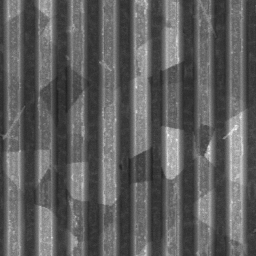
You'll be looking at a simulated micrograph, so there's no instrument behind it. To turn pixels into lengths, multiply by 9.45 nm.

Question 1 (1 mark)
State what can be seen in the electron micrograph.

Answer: parallel lines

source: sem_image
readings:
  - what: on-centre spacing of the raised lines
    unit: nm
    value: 300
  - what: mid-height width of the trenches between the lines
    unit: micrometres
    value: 0.151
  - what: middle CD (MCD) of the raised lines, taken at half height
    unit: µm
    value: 0.15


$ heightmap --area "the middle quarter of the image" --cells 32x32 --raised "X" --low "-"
-XXXX----XXXX----XXXX----XXXX---
-XXXX----XXXX----XXXX----XXXX---
-XXXX----XXXX----XXXX----XXXX---
-XXXX----XXXX----XXXX----XXXX---
-XXXX----XXXX----XXXX----XXXX---
-XXXX----XXXX----XXXX----XXXX---
-XXXX----XXXX----XXXX----XXXX---
-XXXX----XXXX----XXXX----XXXX---
-XXXX----XXXX----XXXX----XXXX---
-XXXX----XXXX----XXXX----XXXX---
-XXXX----XXXX----XXXX----XXXX---
-XXXX----XXXX----XXXX----XXXX---
-XXXX----XXXX----XXXX----XXXX---
-XXXX----XXXX----XXXX----XXXX---
-XXXX----XXXX----XXXX----XXXX---
-XXXX----XXXX----XXXX----XXXX---
-XXXX----XXXX----XXXX----XXXX---
-XXXX----XXXX----XXXX----XXXX---
-XXXX----XXXX----XXXX----XXXX---
-XXXX----XXXX----XXXX----XXXX---
-XXXX----XXXX----XXXX----XXXX---
-XXXX----XXXX----XXXX----XXXX---
-XXXX----XXXX----XXXX----XXXX---
-XXXX----XXXX----XXXX----XXXX---
-XXXX----XXXX----XXXX----XXXX---
-XXXX----XXXX----XXXX----XXXX---
-XXXX----XXXX----XXXX----XXXX---
-XXXX----XXXX----XXXX----XXXX---
-XXXX----XXXX----XXXX----XXXX---
-XXXX----XXXX----XXXX----XXXX---
-XXXX----XXXX----XXXX----XXXX---
-XXXX----XXXX----XXXX----XXXX---